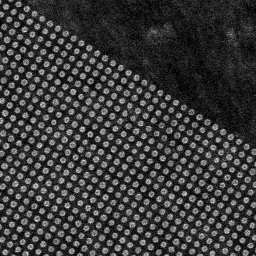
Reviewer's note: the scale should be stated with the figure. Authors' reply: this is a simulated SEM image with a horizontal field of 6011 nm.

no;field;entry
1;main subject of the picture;a regular array of raised bodies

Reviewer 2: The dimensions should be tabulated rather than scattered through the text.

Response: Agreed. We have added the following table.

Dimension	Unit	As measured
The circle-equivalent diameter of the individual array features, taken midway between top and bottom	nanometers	127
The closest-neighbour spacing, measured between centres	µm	0.209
